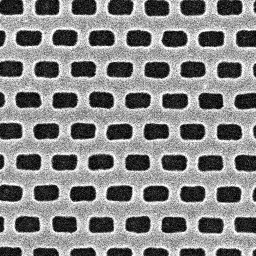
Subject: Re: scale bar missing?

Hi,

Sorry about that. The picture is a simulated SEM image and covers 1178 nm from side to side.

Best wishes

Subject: a regular array of holes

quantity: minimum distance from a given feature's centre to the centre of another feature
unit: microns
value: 0.164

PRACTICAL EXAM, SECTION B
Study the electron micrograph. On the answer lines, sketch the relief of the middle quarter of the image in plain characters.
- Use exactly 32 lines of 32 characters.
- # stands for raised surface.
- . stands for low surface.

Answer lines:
##......###......###......###...
##......###......###.......##...
##......##.......###......###...
######################...#####..
################################
################################
################################
...###......####.....####.#...##
....##......###.......##.......#
....##.......##.......###......#
...###......###......####......#
################################
################################
################################
###.############################
##......###......###......###...
##......###......###......###...
##......##.......###......###...
##.....####......###......###...
################################
################################
################################
########...######...#######..###
...###......###......###.......#
....##.......##......###.......#
...###.......##......###.......#
...####....#####.....####.....##
################################
################################
################################
###....#####....#####....#####.#
##......###......###......###...